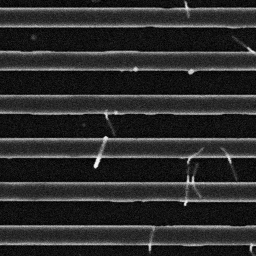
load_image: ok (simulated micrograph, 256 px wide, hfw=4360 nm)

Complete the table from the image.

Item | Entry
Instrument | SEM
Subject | lines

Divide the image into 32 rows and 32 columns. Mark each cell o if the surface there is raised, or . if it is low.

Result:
................................
oooooooooooooooooooooooooooooooo
oooooooooooooooooooooooooooooooo
................................
................................
................................
oo.............oo..............o
oooooooooooooooooooooooooooooooo
oooooooooooooooooooooooooooooooo
................................
................................
................................
oooooooooooooooooooooooooooooooo
oooooooooooooooooooooooooooooooo
................................
................................
................................
oooooooooooooooooooooooooooooooo
oooooooooooooooooooooooooooooooo
oooooooooooooooooooooooooooooooo
................................
................................
................................
oooooooooooooooooooooooooooooooo
oooooooooooooooooooooooooooooooo
................................
................................
................................
oooooooooooooooooooooooooooooooo
oooooooooooooooooooooooooooooooo
oooooooooooooooooooooooooooooooo
................................